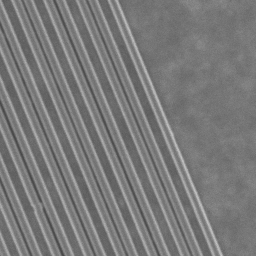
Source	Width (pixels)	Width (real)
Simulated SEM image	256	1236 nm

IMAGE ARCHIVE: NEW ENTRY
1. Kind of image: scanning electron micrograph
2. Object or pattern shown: parallel lines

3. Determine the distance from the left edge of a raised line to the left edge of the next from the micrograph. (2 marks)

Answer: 72.4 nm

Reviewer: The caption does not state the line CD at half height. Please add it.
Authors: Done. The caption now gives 35.2 nm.